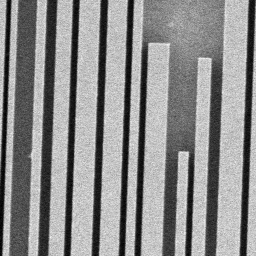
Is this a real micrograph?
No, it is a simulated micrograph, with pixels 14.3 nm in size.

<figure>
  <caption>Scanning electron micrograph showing groups of lines, slits or small figures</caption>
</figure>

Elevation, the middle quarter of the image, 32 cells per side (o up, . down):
oo.ooooo...oooo..oo..ooooo......
oo.ooooo...oooo..oo..ooooo......
oo.ooooo...oooo..oo..ooooo......
o..ooooo...oooo..oo..ooooo......
o..ooooo...oooo..oo..ooooo......
o..ooooo..ooooo..oo..ooooo......
o..ooooo..ooooo..oo..ooooo......
o..ooooo..ooooo..oo..ooooo......
o..ooooo..ooooo..oo..ooooo......
o..ooooo..ooooo..oo..ooooo......
o..ooooo..ooooo..oo..ooooo......
o..ooooo..ooooo..oo..ooooo......
o..ooooo..ooooo..oo..ooooo......
o..ooooo..ooooo..oo..ooooo......
o..ooooo..ooooo..oo..ooooo......
o..ooooo..ooooo..oo..ooooo......
o..ooooo..ooooo..o...ooooo......
o..ooooo..ooooo..o..ooooo.......
o..ooooo..ooooo..o..ooooo.......
o..ooooo..ooooo..o..ooooo.......
o..ooooo..oooo..oo..ooooo.......
o..ooooo..oooo..oo..ooooo.......
o..ooooo..oooo..oo..ooooo....oo.
o..oooo...oooo..oo..ooooo....oo.
o..oooo...oooo..oo..ooooo....oo.
o..oooo...oooo..oo..ooooo....oo.
o.ooooo...oooo..oo..ooooo....oo.
o.ooooo...oooo..oo..ooooo....oo.
o.ooooo...oooo..oo..ooooo....oo.
o.ooooo...oooo..oo..ooooo...ooo.
..ooooo...oooo..oo..ooooo...ooo.
..ooooo...oooo..oo..ooooo...ooo.